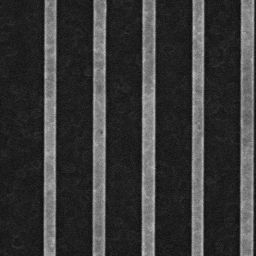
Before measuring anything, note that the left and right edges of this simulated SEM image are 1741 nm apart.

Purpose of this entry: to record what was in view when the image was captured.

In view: parallel lines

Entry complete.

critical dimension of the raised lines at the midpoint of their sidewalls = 75.6 nanometers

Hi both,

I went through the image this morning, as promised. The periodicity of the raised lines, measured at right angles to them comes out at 0.335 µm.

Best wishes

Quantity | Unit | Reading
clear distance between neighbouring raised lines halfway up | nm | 258